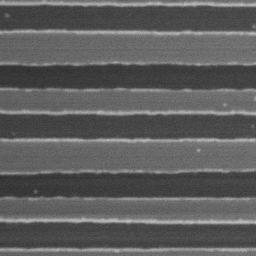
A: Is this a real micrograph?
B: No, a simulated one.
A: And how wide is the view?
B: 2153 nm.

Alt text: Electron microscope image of lines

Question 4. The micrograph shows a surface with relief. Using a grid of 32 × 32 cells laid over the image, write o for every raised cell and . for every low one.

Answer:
ooooo.oooooooooooooooooooooooooo
................................
................................
................................
oooooooooooooooooooooooooooooooo
oooooooooooooooooooooooooooooooo
oooooooooooooooooooooooooooooooo
oooooooooooooooooooooooooooooooo
................................
................................
................................
oooooooooooooooooooooooooooooooo
oooooooooooooooooooooooooooooooo
oooooooooooooooooooooooooooooooo
................................
................................
................................
o.....o.........................
oooooooooooooooooooooooooooooooo
oooooooooooooooooooooooooooooooo
oooooooooooooooooooooooooooooooo
ooooooooo....oo....oooo.........
................................
................................
................................
oooooooooooooooooooooooooooooooo
oooooooooooooooooooooooooooooooo
oooooooooooooooooooooooooooooooo
................................
................................
................................
oooooooooooooooooooooooooooooooo